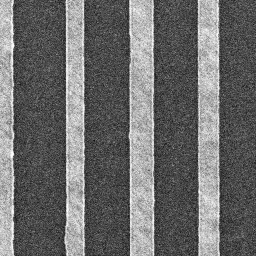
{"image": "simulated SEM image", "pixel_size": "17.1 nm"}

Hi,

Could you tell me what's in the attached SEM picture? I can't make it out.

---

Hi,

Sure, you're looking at one or a few lines or trenches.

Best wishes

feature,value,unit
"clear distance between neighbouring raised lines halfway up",0.804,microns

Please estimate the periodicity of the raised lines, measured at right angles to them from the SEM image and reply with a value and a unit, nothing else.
66.8 px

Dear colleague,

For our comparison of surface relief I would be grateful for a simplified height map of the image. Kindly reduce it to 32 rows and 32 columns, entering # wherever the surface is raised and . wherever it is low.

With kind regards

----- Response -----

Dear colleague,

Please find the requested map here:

##......##......###......##.....
##......##......###......##.....
##......##......###......##.....
##......##......###......##.....
##......##......###......##.....
##......##......###......##.....
##......##......###......##.....
#.......##......###......##.....
##......##......###......##.....
##......##......###......##.....
##......##......###......##.....
##......##......###......##.....
#.......##......###......##.....
##......##......###......##.....
##......##......###......##.....
##......##......###......##.....
##......##......###......##.....
##......##......###......##.....
#.......##......###......##.....
#.......##......###......##.....
#.......##......###......##.....
##......##......###......##.....
##......##......###......##.....
##......##......###......##.....
##......##......###......##.....
##......##......###......##.....
##......##......###......##.....
##......##......###......##.....
##......##......###......##.....
##......##......###......##.....
##......##......###......##.....
##......##......###......##.....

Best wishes